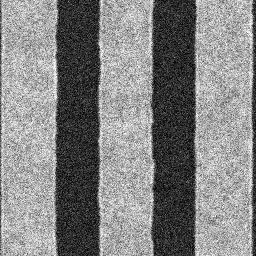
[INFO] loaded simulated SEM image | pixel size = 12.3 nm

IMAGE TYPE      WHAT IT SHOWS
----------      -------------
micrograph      one or a few lines or trenches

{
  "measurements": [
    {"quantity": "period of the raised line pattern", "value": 97.8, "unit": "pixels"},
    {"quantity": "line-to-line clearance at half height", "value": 0.559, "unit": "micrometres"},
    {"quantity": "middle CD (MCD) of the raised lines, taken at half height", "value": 53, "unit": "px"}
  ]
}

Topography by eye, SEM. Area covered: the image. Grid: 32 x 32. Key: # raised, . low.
#######......######......######.
#######......######......######.
#######......######......######.
#######......######......######.
#######......######......######.
#######......######......######.
#######......######......######.
#######......######......######.
#######......######......######.
#######......######......######.
#######......######......######.
#######......######......######.
#######......######......######.
#######......######......######.
#######......######......######.
#######......######......######.
#######......######......######.
#######......######......######.
#######......######......######.
#######......######......######.
#######......######......######.
#######......######......######.
#######......######......######.
#######......######......######.
#######.....#######......######.
#######......######......######.
#######......######......######.
#######......######......######.
#######......######......######.
#######......######......######.
#######......######......######.
#######......######......######.